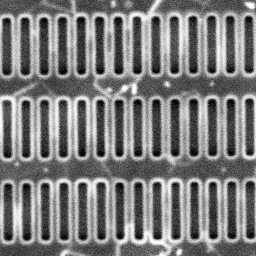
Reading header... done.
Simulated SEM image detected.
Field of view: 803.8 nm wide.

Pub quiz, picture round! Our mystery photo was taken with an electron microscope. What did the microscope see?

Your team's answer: groups of lines, slits or small figures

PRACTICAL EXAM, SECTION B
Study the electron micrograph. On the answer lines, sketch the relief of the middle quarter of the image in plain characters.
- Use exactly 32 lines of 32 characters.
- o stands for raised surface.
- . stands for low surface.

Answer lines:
.oo...oo..oo...oo...oo..oo...oo.
.oo...oo..oo...oo...oo..oo...oo.
.oo..ooo..ooo..ooo.ooo..ooo.oooo
oooooooooooooooooooooooooooooooo
oooooooooooooooooooooooooooooooo
oooooooooooooooooooooooooooooooo
oooooooooooooooooooooooooooooooo
oooooooooooooooooooooooooooooooo
oooooooooooooooooooooooooooooooo
.oo...oo..ooo..oo...oo..oo...oo.
.oo...oo..oo...oo...oo..oo...oo.
.oo...oo..oo...oo...oo..oo...oo.
.oo...oo..oo...oo...oo...o...oo.
.oo...oo..oo...oo...oo...o...oo.
.oo...oo..oo...oo...oo...o...oo.
.oo...oo..oo...oo...oo...o...oo.
.oo...oo..oo...oo...oo...o...oo.
.oo...oo..oo...oo...oo...o...oo.
.oo...oo...o...oo...oo...o...oo.
.oo...oo...o...oo...oo...o...oo.
.oo...oo...o...oo...oo...o...oo.
.oo...oo...oo..oo...oo...o...oo.
.oo...oo..ooo..oo...oo..ooo..oo.
.ooo.oooo.oooooooo.oooo.oooooooo
oooooooooooooooooooooooooooooooo
oooooooooooooooooooooooooooooooo
oooooooooooooooooooooooooooooooo
oooooooooooooooooooooooooooooooo
oooooooooooooooooooooooooooooooo
.ooo..oo..ooo.oooo.ooo..ooo..ooo
.oo...oo...oo..oo...oo...o...oo.
.oo...oo...oo..oo...oo...o...oo.